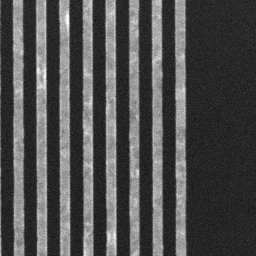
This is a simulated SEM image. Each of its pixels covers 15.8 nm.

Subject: parallel lines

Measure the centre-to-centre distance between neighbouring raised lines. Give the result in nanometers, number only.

366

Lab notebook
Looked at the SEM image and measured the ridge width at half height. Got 142 nm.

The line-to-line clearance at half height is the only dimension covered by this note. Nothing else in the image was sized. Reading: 225 nanometres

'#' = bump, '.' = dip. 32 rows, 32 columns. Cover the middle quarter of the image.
#....##....##....##...##....##..
#....##....##....##...##....##..
#.....#....##....##...##....##..
#....##....##....##...##....##..
#....##....##....##...##....##..
#....##....##....##...##....##..
#....##....##....##...##....##..
#....##....##....##...##....##..
#....##....##....##...##....##..
#....##....##....##...##....##..
#....##....##....##...##....##..
#....##....##....##...##....##..
#....##....##....##...##....##..
#....##....##....##...##....##..
#....##....##....##...##....##..
#....##....##....##...##....##..
#....##....##....##...##....##..
#....##....##....##...##....##..
#....##....##....##...##....##..
#....##....##....##...##....##..
#....##....##....##...##....##..
#....##....##....##...##....##..
#....##....##....##...##....##..
#....##....##....##...##....##..
#....##....##....##...##....##..
#....##....##....##...##....##..
#....##....##....##...##....##..
#....##....##....##...##....##..
#....##....##....##...##....##..
#....##....##....##...##....##..
#....##....##....##...##....##..
#....##....##....##...##....##..